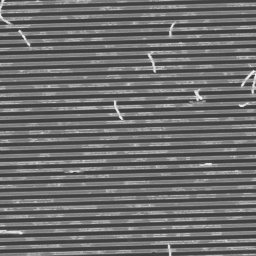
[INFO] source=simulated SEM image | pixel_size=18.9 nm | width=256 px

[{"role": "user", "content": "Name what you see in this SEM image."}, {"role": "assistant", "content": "parallel lines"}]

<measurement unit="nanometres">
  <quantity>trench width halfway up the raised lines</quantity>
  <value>70.8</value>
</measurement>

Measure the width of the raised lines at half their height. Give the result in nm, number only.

70.8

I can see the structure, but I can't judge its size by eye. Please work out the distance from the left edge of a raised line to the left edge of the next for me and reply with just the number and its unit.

7.61 px